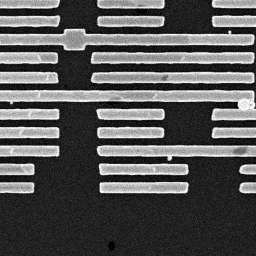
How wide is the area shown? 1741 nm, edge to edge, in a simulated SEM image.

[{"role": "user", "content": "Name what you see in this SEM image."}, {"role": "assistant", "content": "wiring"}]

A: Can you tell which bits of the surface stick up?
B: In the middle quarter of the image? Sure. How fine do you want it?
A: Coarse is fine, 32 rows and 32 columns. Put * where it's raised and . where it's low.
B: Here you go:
................................
................................
.......*************************
.......*************************
........**.*******....**...***.*
................................
................................
********************************
********************************
................................
................................
.........******.*********.......
.........****************.......
.........****************.......
................................
................................
.........****************.......
.........****************.......
................................
................................
................................
.........***********************
.........***********************
................................
................................
.........**********************.
.........**********************.
.........***....**.**.....****..
................................
................................
.........**********************.
.........**********************.